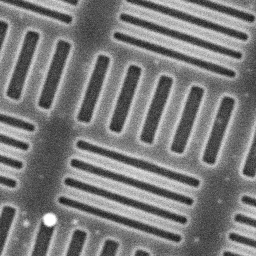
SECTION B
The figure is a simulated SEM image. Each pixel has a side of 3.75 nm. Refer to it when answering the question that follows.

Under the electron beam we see groups of lines, slits or small figures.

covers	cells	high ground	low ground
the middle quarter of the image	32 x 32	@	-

@@@@@-@@---@@@@@---@@@@@@@@@@@@@
@@@@@@@----@@@@@----@@@@@@@@@@@@
@@@@@@@----@@@@----@@@@@@@@@@@@@
@@@@@@----@@@@@----@@@@@---@@@@@
@@@@@@----@@@@@----@@@@@---@@@@@
@@@@@@----@@@@----@@@@@----@@@@@
@@@@@----@@@@@----@@@@@----@@@@-
@@@@@----@@@@@----@@@@-----@@@@-
@@@@@----@@@@----@@@@@----@@@@@-
@@@@----@@@@@----@@@@@----@@@@--
@@@@----@@@@@----@@@@-----@@@@--
@@@@----@@@@----@@@@@----@@@@@--
@@@----@@@@@----@@@@@----@@@@---
@@@----@@@@@----@@@@----@@@@@---
@@@@---@@@@@---@@@@@----@@@@@---
@@@@@@@@@@@----@@@@@----@@@@----
@@@@@@@@@@@----@@@@----@@@@@----
@@@@@@@@@@@@@-@@@@@----@@@@-----
@@@@@@@@@@@@@@@@@@@----@@@@----@
@@@---@@@@@@@@@@@@@----@@@@----@
@@@------@@@@@@@@@@@@@@@@@@----@
@@@@--------@@@@@@@@@@@@@@@---@@
@@@@@@@@-------@@@@@@@@@@@@@@@@@
@@-@@@@@@@@--------@@@@@@@@@@@@@
@-----@@@@@@@@--------@@@@@@@@@@
@--------@@@@@@@--------@@@@@@@@
@@@--------@@@@@@@@--------@@@@@
@@@@@@--------@@@@@@@@--------@@
--@@@@@@@@-------@@@@@@@@-------
-----@@@@@@@@-------@@@@@@@@----
@-------@@@@@@@@-------@@@@@@@@-
@@@--------@@@@@@@@-------@@@@@@